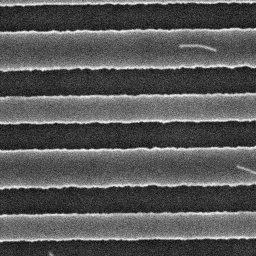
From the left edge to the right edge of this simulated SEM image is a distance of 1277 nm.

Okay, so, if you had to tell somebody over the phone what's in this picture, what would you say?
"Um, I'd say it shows lines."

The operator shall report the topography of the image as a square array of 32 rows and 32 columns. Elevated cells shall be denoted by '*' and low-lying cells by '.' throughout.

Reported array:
******.*........................
................................
................................
................................
********************************
********************************
********************************
********************************
**********************..........
................................
................................
................................
********************************
********************************
********************************
................................
................................
................................
..........................*.****
********************************
********************************
********************************
********************************
*....*..........................
................................
................................
...........................*..*.
********************************
********************************
********************************
................................
................................